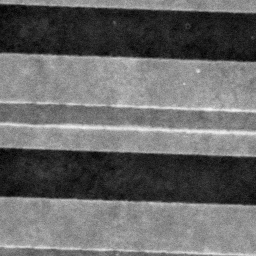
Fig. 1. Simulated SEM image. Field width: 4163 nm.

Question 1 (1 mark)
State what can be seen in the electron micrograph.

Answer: lines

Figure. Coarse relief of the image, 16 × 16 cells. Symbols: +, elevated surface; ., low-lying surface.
.......+++++++++
................
................
+++.............
++++++++++++++++
++++++++++++++++
++++++++++++++++
++++++++++++++++
++++++++++++++++
.........+++++++
................
................
+++++...........
++++++++++++++++
++++++++++++++++
++++++++++++++++